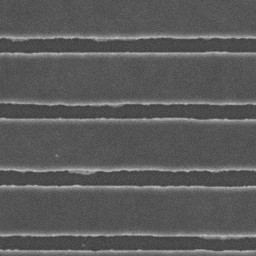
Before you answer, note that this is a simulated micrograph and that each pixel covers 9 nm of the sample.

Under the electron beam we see lines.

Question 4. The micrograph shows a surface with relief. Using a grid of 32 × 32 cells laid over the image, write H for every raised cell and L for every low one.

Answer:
HHHHHHHHHHHHHHHHHHHHHHHHHHHHHHHH
HHHHHHHHHHHHHHHHHHHHHHHHHHHHHHHH
HHHHHHHHHHHHHHHHHHHHHHHHHHHHHHHH
HHHHHHHHHHHHHHHHHHHHHHHHHHHHHHHH
HHHHHHHHHHHHHHHHHHHHHHHHHHHHHHHH
LLLLLLLLLLLLLLLLLLLLLLLLLLLLLLLL
LLLLLLLLLLLLLLLLLLLLLLLLLLLLLLLL
HHHHHHHHHHHHHHHHHHHHHHHHHHHHHHHH
HHHHHHHHHHHHHHHHHHHHHHHHHHHHHHHH
HHHHHHHHHHHHHHHHHHHHHHHHHHHHHHHH
HHHHHHHHHHHHHHHHHHHHHHHHHHHHHHHH
HHHHHHHHHHHHHHHHHHHHHHHHHHHHHHHH
HHHHHHHHHHHHHHHHHHHHHHHHHHHHHHHH
LLLLLLLLLLLLLLLLLLLLLLLLLLLLLLLL
LLLLLLLLLLLLLLLLLLLLLLLLLLLLLLLL
HHHHHHHHHHHHHHHHHHHHHHHHHHHHHHHH
HHHHHHHHHHHHHHHHHHHHHHHHHHHHHHHH
HHHHHHHHHHHHHHHHHHHHHHHHHHHHHHHH
HHHHHHHHHHHHHHHHHHHHHHHHHHHHHHHH
HHHHHHHHHHHHHHHHHHHHHHHHHHHHHHHH
HHHHHHHHHHHHHHHHHHHHHHHHHHHHHHHH
LLLLLLLLLLLLLLLLLLLLLLLLLLLLLLLL
LLLLLLLLLLLLLLLLLLLLLLLLLLLLLLLL
HHHHHHHHHHHHHHHHHHHHHHHHHHHHHHHH
HHHHHHHHHHHHHHHHHHHHHHHHHHHHHHHH
HHHHHHHHHHHHHHHHHHHHHHHHHHHHHHHH
HHHHHHHHHHHHHHHHHHHHHHHHHHHHHHHH
HHHHHHHHHHHHHHHHHHHHHHHHHHHHHHHH
HHHHHHHHHHHHHHHHHHHHHHHHHHHHHHHH
LLLLLLLLLLLLLLLLLLLLLLLLLLLHHLLL
LLLLLLLLLLLLLLLLLLLLLLLLLLLLLLLL
HHHHHHHHHHHHHHHHHHHHHHHHHHHHHHHH